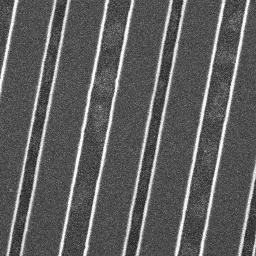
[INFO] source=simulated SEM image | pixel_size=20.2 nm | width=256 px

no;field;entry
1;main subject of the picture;parallel lines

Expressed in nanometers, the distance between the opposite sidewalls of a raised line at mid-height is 779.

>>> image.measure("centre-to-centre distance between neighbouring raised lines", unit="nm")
1150